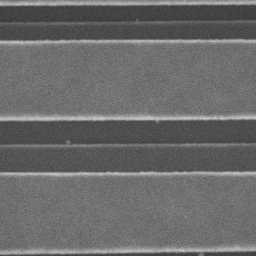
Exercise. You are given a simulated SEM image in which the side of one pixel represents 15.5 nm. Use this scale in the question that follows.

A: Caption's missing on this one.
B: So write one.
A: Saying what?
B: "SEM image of lines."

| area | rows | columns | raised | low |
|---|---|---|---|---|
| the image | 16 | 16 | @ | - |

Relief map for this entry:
----------------
----------------
-----------@@@@@
@@@@@@@@@@@@@@@@
@@@@@@@@@@@@@@@@
@@@@@@@@@@@@@@@@
@@@@@@@@@@@@@@@@
@@--------------
----------------
----------------
----------------
@@@@@@@@@@@@@@@@
@@@@@@@@@@@@@@@@
@@@@@@@@@@@@@@@@
@@@@@@@@@@@@@@@@
@@@@@@@@@@@@@@@@